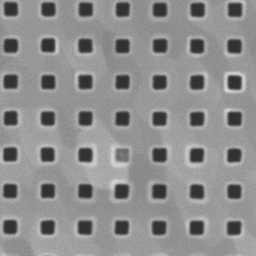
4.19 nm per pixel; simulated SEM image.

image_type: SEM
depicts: a regular array of holes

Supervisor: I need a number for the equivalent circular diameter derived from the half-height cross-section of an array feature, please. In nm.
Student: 67.3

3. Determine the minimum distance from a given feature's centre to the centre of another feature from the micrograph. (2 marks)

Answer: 152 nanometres